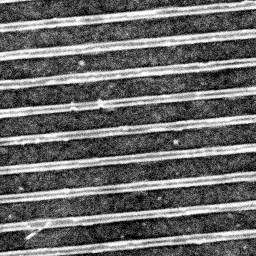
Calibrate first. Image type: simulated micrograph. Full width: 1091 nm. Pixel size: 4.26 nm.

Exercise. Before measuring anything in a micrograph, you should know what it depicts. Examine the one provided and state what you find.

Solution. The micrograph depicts parallel lines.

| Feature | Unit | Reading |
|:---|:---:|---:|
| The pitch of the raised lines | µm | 0.121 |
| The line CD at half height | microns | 0.0307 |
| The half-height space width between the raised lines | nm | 91.7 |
